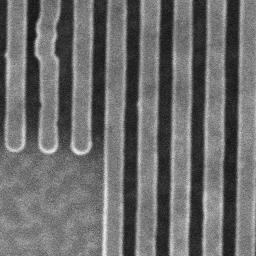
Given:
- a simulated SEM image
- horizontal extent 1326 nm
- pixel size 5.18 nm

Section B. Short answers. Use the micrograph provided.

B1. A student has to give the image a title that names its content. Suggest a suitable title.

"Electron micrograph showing parallel lines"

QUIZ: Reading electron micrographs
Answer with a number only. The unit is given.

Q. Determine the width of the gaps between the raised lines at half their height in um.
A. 0.077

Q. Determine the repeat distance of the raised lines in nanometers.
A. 172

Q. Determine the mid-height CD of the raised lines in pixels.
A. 18.9